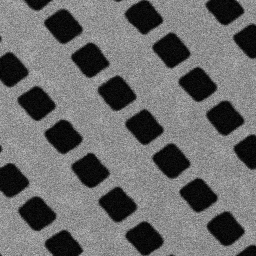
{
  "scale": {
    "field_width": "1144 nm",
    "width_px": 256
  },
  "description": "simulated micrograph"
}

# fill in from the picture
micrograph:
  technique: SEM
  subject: a regular array of holes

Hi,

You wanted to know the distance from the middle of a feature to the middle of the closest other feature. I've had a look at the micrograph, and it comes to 193 nanometers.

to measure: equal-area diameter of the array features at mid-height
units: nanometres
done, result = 143